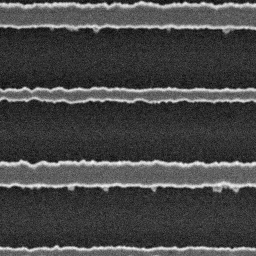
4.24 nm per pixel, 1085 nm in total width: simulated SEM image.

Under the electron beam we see lines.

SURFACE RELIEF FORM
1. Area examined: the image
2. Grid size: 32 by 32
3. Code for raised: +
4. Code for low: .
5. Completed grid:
+++.++++++.+++++.+++.++++++.++++
++++++++++++++++++++++++++++++++
++++++++++++++++++++++++++++++++
..+......+..+.+...+.+.+++.++.+++
................................
................................
................................
................................
................................
................................
................................
++++++++++++++++++++++++++++++++
.+++.+++++++++++++++++++++++++++
................................
................................
................................
................................
................................
................................
................................
++++++++++++++++++++++++++++++++
++++++++++++++++++++++++++++++++
++++++++++++++++++++++++++++++++
........................+.......
................................
................................
................................
................................
................................
................................
................................
++++++++++++++++++++++++++++++++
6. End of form